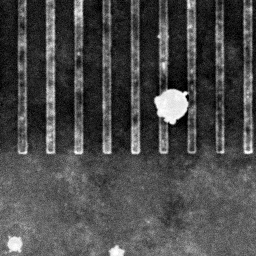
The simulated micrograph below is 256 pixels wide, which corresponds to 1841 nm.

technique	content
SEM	parallel lines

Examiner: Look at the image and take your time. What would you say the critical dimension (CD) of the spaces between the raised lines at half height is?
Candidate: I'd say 152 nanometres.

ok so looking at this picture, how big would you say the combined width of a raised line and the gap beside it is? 203 nanometers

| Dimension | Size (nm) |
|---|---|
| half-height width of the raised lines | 50.3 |